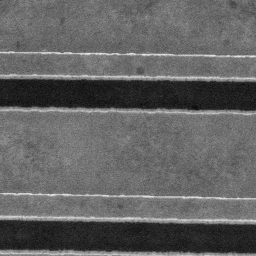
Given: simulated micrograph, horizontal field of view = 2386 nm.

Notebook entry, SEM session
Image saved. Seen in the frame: lines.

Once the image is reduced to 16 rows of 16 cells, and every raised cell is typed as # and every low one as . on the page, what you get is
################
################
################
################
################
................
................
################
################
################
################
################
################
################
................
................